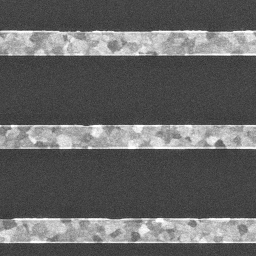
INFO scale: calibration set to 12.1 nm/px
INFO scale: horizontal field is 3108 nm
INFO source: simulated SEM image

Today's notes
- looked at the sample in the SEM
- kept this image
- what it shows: lines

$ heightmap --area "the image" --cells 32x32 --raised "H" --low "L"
LLLLLLLLLLLLLLLLLLLLLLLLLLLLLLLL
LLLLLLLLLLLLLLLLLLLLLLLLLLLLLLLL
LLLLLLLLLLLLLLLLLLLLLLLLLLLLLLLL
LLLLLLLLLLLLLLLLLLLLLLLLLLLLLLLL
HHHHHHHHHHHHHHHHHHHHHHHHHHHHHHHH
HHHHHHHHHHHHHHHHHHHHHHHHHHHHHHHH
HHHHHHHHHHHHHHHHHHHHHHHHHHHHHHHH
LLLLLLLLLLLLLLLLLLLLLLLLLLLLLLLL
LLLLLLLLLLLLLLLLLLLLLLLLLLLLLLLL
LLLLLLLLLLLLLLLLLLLLLLLLLLLLLLLL
LLLLLLLLLLLLLLLLLLLLLLLLLLLLLLLL
LLLLLLLLLLLLLLLLLLLLLLLLLLLLLLLL
LLLLLLLLLLLLLLLLLLLLLLLLLLLLLLLL
LLLLLLLLLLLLLLLLLLLLLLLLLLLLLLLL
LLLLLLLLLLLLLLLLLLLLLLLLLLLLLLLL
LLLLLLLLLLLLLLLLLLLLLLLLLLLLLLLL
HHHHHHHHHHHHHHHHHHHHHHHHHHHHHHHH
HHHHHHHHHHHHHHHHHHHHHHHHHHHHHHHH
LLLLLLLLLLLLLLLLLLLLLLLLLLLLLLLL
LLLLLLLLLLLLLLLLLLLLLLLLLLLLLLLL
LLLLLLLLLLLLLLLLLLLLLLLLLLLLLLLL
LLLLLLLLLLLLLLLLLLLLLLLLLLLLLLLL
LLLLLLLLLLLLLLLLLLLLLLLLLLLLLLLL
LLLLLLLLLLLLLLLLLLLLLLLLLLLLLLLL
LLLLLLLLLLLLLLLLLLLLLLLLLLLLLLLL
LLLLLLLLLLLLLLLLLLLLLLLLLLLLLLLL
LLLLLLLLLLLLLLLLLLLLLLLLLLLLLLLL
LLHHHHHHHHHHHHLHHHHHHHHHHHHHHHHH
HHHHHHHHHHHHHHHHHHHHHHHHHHHHHHHH
HHHHHHHHHHHHHHHHHHHHHHHHHHHHHHHH
LLLLLLLLLLLLLLLLLLLLLLLLLLLLLLLL
LLLLLLLLLLLLLLLLLLLLLLLLLLLLLLLL